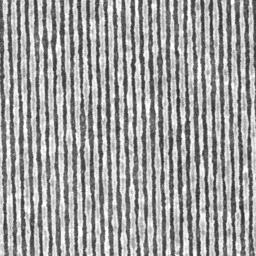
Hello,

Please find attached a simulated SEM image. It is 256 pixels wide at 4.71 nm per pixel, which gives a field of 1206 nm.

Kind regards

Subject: parallel lines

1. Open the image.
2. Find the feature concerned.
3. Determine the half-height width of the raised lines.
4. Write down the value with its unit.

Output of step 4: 18.3 nm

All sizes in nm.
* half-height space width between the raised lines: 23.5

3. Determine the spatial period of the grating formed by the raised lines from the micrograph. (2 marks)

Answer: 41.3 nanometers